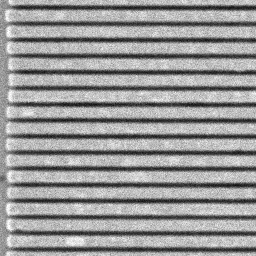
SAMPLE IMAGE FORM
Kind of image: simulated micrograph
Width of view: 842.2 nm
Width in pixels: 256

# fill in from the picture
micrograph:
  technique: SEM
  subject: parallel lines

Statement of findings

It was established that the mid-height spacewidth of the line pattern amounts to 16 nanometers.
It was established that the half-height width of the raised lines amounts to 35.3 nanometers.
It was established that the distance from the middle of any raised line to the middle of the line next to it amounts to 52.9 nanometers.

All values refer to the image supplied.